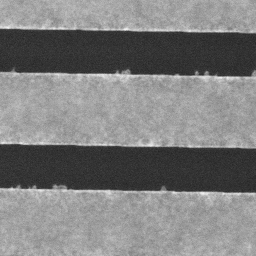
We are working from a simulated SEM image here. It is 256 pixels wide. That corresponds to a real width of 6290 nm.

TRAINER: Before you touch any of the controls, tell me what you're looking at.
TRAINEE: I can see lines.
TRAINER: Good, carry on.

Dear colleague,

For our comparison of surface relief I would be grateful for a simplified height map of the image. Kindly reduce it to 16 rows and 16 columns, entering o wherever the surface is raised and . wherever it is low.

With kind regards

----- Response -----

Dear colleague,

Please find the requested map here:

oooooooooooooooo
oooooooooooooooo
................
................
................
oooooooooooooooo
oooooooooooooooo
oooooooooooooooo
oooooooooooooooo
................
................
................
oooooooooooooooo
oooooooooooooooo
oooooooooooooooo
oooooooooooooooo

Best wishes